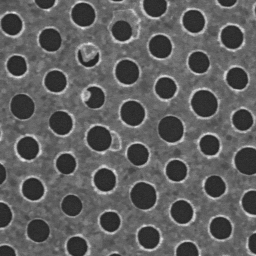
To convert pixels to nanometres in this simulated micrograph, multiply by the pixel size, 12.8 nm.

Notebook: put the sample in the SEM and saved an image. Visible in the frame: a regular array of holes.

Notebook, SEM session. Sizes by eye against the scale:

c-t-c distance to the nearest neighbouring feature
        530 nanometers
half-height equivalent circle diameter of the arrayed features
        293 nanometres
